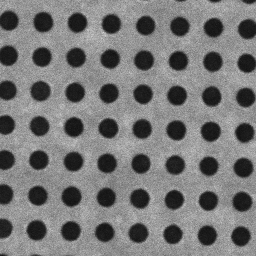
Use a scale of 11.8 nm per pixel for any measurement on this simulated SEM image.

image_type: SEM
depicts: a regular array of holes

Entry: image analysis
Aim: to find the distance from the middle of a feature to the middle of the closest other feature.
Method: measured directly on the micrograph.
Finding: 402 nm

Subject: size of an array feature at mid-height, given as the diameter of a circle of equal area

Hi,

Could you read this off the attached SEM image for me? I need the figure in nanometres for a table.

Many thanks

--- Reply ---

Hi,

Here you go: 229